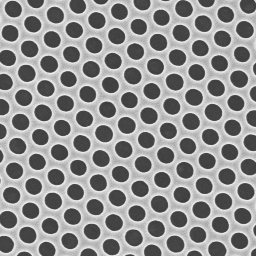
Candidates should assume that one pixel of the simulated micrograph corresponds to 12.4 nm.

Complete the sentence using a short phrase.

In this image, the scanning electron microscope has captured a regular array of holes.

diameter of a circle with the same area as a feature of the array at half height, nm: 213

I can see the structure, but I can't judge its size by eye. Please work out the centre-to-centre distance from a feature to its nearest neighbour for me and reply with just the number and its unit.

300 nm